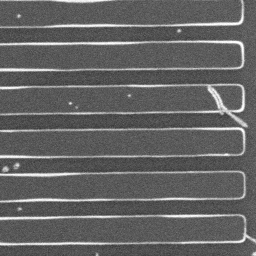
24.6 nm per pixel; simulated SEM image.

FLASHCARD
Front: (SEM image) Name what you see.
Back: groups of lines, slits or small figures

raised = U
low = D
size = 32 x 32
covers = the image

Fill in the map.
UUUUUUUUUUUUUUUUUUUUUUUUUUUUUUDD
UUUUUUUUUUUUUUUUUUUUUUUUUUUUUUDD
UUUUUUUUUUUUUUUUUUUUUUUUUUUUUUDD
DDDDDDDDDDDDDDDDDDDDDDDDDDDDDDDD
DDDDDDDDDDDDDDDDDDDDDDDDDDDDDDDD
DDDDDDDDDUUUUUUUUUUUUUUUUUUUUUDD
UUUUUUUUUUUUUUUUUUUUUUUUUUUUUUDD
UUUUUUUUUUUUUUUUUUUUUUUUUUUUUUDD
UUUUUUUUUUUUUUUUUUUUUUUUUDDDDDDD
DDDDDDDDDDDDDDDDDDDDDDDDDDDDDDDD
DDDDDDDDDDDDDDDDDDDDDDDDDDDDDDDD
UUUUUUUUUUUUUUUUUUUUUUUUUUUUUUDD
UUUUUUUUUUUUUUUUUUUUUUUUUUUUUUDD
UUUUUUUUUUUUUUUUUUUUUUUUUUUUUUDD
DDDDDDDDDDDDDDDDDDDDDDDDDDDDDDDD
DDDDDDDDDDDDDDDDDDDDDDDDDDDDDDDD
UUUUUUUUUUUUUUUUUUUUUUUUUUUUUUDD
UUUUUUUUUUUUUUUUUUUUUUUUUUUUUUDD
UUUUUUUUUUUUUUUUUUUUUUUUUUUUUUDD
UUUUUUUUUUUUUUUUUUUUUUDDDDDDDDDD
DDDDDDDDDDDDDDDDDDDDDDDDDDDDDDDD
DDDDDDDDDDDDDDDDDDDDDDDDDDDDDDDD
UUUUUUUUUUUUUUUUUUUUUUUUUUUUUUDD
UUUUUUUUUUUUUUUUUUUUUUUUUUUUUUDD
UUUUUUUUUUUUUUUUUUUUUUUUUUUUUUDD
DDDDDDDDDDDDDDDDDDDDDDDDDDDDDDDD
DDDDDDDDDDDDDDDDDDDDDDDDDDDDDDDD
UUUUUUUUUUUUUUUUUUUUUUUUUUUUUUUD
UUUUUUUUUUUUUUUUUUUUUUUUUUUUUUUD
UUUUUUUUUUUUUUUUUUUUUUUUUUUUUUUD
DDDDDDDDDDDDDDDDDDDDDDDDDDDDDDDD
DDDDDDDDDDDDDDDDDDDDDDDDDDDDDDDD